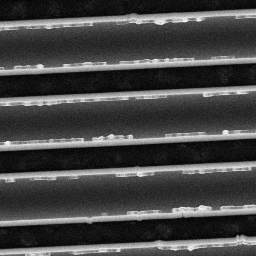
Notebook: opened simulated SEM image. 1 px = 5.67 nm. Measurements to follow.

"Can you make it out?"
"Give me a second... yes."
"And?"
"one or a few lines or trenches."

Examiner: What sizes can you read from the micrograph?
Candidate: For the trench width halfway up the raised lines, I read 0.155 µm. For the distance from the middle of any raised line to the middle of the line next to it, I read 429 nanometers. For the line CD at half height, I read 270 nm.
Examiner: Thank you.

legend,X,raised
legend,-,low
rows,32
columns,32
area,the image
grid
--------------------------------
--------------------------------
-----------XXXXXXXXXXXXXXXXXXXXX
XXXXXXXXXXXXXXXXXXXXXXXXXXXXXXXX
XXXXXXXXXXXXXXXXXXXXXXXXXXXXXXXX
XXXXXXXXXXXXXXXXXXXXXXXXXXXXXXXX
XXXXXXXXXXXXXXXXXXXXXXXXXXXXXXXX
XXXXXXXXXXXXXXXXXXXXXXXXXXXXXXXX
XXXXXXXXXXX---------------------
--------------------------------
--------------------------------
-----------------------XXXXXXXXX
---XXXXXXXXXXXXXXXXXXXXXXXXXXXXX
XXXXXXXXXXXXXXXXXXXXXXXXXXXXXXXX
XXXXXXXXXXXXXXXXXXXXXXXXXXXXXXXX
XXXXXXXXXXXXXXXXXXXXXXXXXXXXXXXX
XXXXXXXXXXXXXXXXXXXXXXXXXXXXXXXX
XXXXXXXXXXXXXXXXXXXX------------
--------------------------------
--------------------------------
--------------------------------
------------XXXXXXXXXXXXXXXXXXXX
XXXXXXXXXXXXXXXXXXXXXXXXXXXXXXXX
XXXXXXXXXXXXXXXXXXXXXXXXXXXXXXXX
XXXXXXXXXXXXXXXXXXXXXXXXXXXXXXXX
XXXXXXXXXXXXXXXXXXXXXXXXXXXXXXXX
XXXXXXXXXXXXXXXXXXXXXXXXXXXXXX--
XXXXXXXXXXXX--------------------
--------------------------------
--------------------------------
-------------------XX-XXXXXXXXXX
X-XXXXXXXXXXXXXXXXXXXXXXXXXXXXXX